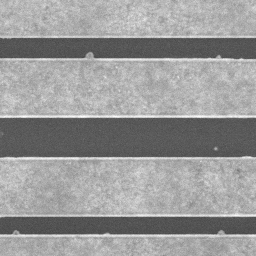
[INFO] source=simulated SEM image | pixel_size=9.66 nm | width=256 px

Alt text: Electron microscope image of lines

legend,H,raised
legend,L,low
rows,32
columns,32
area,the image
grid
HHHHHHHHHHHHHHHHHHHHHHHHHHHHHHHH
HHHHHHHHHHHHHHHHHHHHHHHHHHHHHHHH
HHHHHHHHHHHHHHHHHHHHHHHHHHHHHHHH
HHHHHHHHHHHHHHHHHHHHHHHHHHHHHHHH
HHHHHHHHHHHHHHHHHHHHHHHHHHHHHHHH
LLLLLLLLLLLLLLLLLLLLLLLLLLLLLLLL
LLLLLLLLLLLLLLLLLLLLLLLLLLLLLLLL
HHHHHHHHHHHHHHHHHHHHHHHHHHHHHHHH
HHHHHHHHHHHHHHHHHHHHHHHHHHHHHHHH
HHHHHHHHHHHHHHHHHHHHHHHHHHHHHHHH
HHHHHHHHHHHHHHHHHHHHHHHHHHHHHHHH
HHHHHHHHHHHHHHHHHHHHHHHHHHHHHHHH
HHHHHHHHHHHHHHHHHHHHHHHHHHHHHHHH
HHHHHHHHHHHHHHHHHHHHHHHHHHHHHHHH
HHHHHHHHHHHHHHHHHHHHHHHHHHHHHHHH
LLLLLLLLLLLLLLLLLLLLLLLLLLLLLLLL
LLLLLLLLLLLLLLLLLLLLLLLLLLLLLLLL
LLLLLLLLLLLLLLLLLLLLLLLLLLLLLLLL
LLLLLLLLLLLLLLLLLLLLLLLLLLLLLLLL
LLLLLLLLLLLLLLLLLLLLLLLLLLLLLLLL
HHHHHHHHHHHHHHHHHHHHHHHHHHHHHHHH
HHHHHHHHHHHHHHHHHHHHHHHHHHHHHHHH
HHHHHHHHHHHHHHHHHHHHHHHHHHHHHHHH
HHHHHHHHHHHHHHHHHHHHHHHHHHHHHHHH
HHHHHHHHHHHHHHHHHHHHHHHHHHHHHHHH
HHHHHHHHHHHHHHHHHHHHHHHHHHHHHHHH
HHHHHHHHHHHHHHHHHHHHHHHHHHHHHHHH
LLLLLLLLLLLLLLLLLLLLLLLLLLLLLLLL
LLLLLLLLLLLLLLLLLLLLLLLLLLLLLLLL
HHHHHHHHHHHHHHHHHHHHHHHHHHHHHHHH
HHHHHHHHHHHHHHHHHHHHHHHHHHHHHHHH
HHHHHHHHHHHHHHHHHHHHHHHHHHHHHHHH